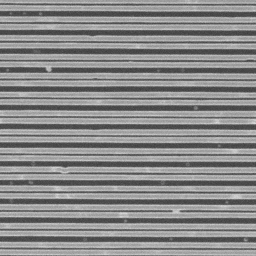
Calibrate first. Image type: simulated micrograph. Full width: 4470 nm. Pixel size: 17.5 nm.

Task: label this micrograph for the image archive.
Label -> parallel lines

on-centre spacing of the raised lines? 164 nanometers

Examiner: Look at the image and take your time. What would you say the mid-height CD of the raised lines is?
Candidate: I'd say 78.6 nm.